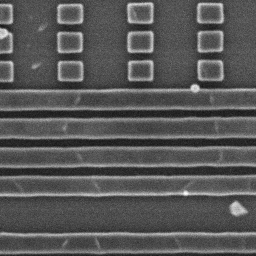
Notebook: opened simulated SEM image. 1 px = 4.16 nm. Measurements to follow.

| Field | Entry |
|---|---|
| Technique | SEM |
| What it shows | wiring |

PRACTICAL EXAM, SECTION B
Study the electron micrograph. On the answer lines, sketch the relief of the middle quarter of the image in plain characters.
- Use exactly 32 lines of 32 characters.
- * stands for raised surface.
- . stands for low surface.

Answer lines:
*****...........******..........
*****...........******..........
*****...........******..........
*****...........******..........
................................
................................
...........*********************
********************************
********************************
********************************
********************************
................................
................................
...............................*
********************************
********************************
********************************
********************************
*************...*************...
................................
................................
********************************
********************************
********************************
********************************
***.............................
................................
................................
********************************
********************************
********************************
********************************